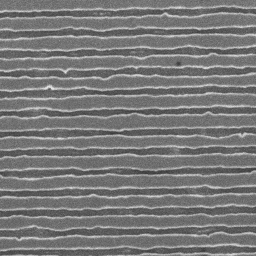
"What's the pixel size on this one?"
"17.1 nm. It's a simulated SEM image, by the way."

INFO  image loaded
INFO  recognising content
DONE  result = parallel lines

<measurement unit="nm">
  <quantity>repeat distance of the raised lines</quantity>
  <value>341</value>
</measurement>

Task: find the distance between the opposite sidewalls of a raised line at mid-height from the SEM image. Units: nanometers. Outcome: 218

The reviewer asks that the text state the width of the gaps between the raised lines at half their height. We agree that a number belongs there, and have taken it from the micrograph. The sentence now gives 118 nm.